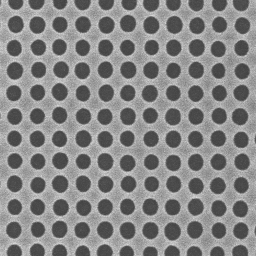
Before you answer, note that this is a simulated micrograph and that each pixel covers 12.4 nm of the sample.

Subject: a regular array of holes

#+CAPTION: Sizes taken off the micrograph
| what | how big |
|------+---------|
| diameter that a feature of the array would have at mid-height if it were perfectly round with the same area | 204 nm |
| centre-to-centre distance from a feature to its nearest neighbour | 273 nm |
